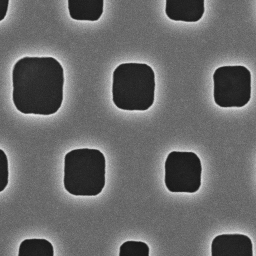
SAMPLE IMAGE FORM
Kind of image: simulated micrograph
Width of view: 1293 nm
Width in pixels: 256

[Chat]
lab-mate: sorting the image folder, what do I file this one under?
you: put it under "holes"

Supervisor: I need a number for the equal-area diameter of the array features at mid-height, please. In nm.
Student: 241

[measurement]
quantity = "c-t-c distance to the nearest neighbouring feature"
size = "496 nanometers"